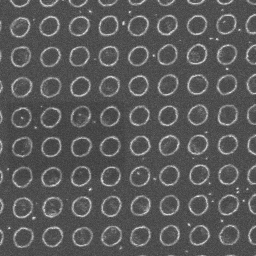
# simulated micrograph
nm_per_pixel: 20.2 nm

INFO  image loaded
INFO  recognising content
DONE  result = a regular array of raised bodies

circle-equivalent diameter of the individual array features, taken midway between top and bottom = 394 nanometers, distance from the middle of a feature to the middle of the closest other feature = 590 nm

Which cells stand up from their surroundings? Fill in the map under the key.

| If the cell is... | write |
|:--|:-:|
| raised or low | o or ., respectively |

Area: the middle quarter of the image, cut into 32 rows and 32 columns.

................................
................................
................................
....o......oo.....oo.....ooo....
..oooo....oooo..ooooo...oooo...o
..ooooo..ooooo..ooooo...oooo...o
..oooo...oooo....oooo...oooo...o
..ooo.....oo.....ooo.....oo.....
................................
................................
................................
...ooo....ooo....oooo...oooo....
..oooo...ooooo...oooo...oooo...o
..oooo...ooooo...oooo...oooo...o
..oooo...oooo....oooo...oooo....
...oo...........................
................................
................................
....oo.....oo.....ooo....ooo....
..ooooo...oooo...oooo...ooooo..o
..ooooo..ooooo...oooo...ooooo..o
..oooo...ooooo...oooo...oooo...o
..oooo....ooo....ooo.....oo.....
................................
................................
..........................o.....
...ooo....oooo...oooo....ooo....
..ooooo...oooo...oooo...ooooo..o
..ooooo..ooooo...oooo...ooooo...
..oooo....ooo....oooo....ooo....
...o............................
................................